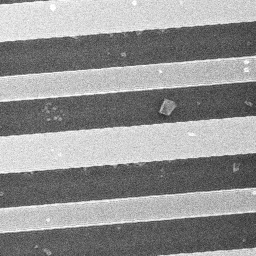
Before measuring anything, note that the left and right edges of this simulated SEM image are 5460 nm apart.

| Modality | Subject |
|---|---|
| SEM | lines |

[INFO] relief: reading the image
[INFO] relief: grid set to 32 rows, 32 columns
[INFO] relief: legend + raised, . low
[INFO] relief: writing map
.+++++++++++++++++++++++++++++++
++++++++++++++++++++++++++++++++
++++++++++++++++++++++++++++++++
++++++++++++++++++++............
++++++++........................
................................
................................
..........................++++++
..............++++++++++++++++++
..++++++++++++++++++++++++++++++
++++++++++++++++++++++++++......
++++++++++++++..................
++..............................
................................
................................
....................++++++++++++
........++++++++++++++++++++++++
++++++++++++++++++++++++++++++++
++++++++++++++++++++++++++++++++
+++++++++++++++++++++++++++.....
+++++++++++++++.................
+...............................
................................
................................
....................++++++++++++
.......+++++++++++++++++++++++++
+++++++++++++++++++++++++++++++.
++++++++++++++++++++............
+++++++.........................
................................
................................
...........................+++++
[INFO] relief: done